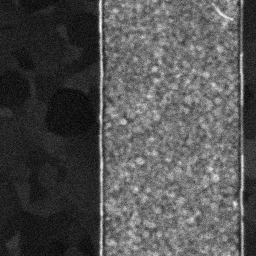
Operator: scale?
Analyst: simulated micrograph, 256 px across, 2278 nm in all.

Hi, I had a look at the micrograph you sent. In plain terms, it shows one or a few lines or trenches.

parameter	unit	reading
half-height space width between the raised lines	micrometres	1.24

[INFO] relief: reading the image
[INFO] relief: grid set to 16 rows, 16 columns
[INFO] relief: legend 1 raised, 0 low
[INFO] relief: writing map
1111110000000001
1111110000000001
1111110000000001
1111110000000001
1111110000000001
1111110000000001
1111110000000001
1111110000000001
1111110000000001
1111110000000001
1111110000000001
1111110000000001
1111110000000001
1111110000000001
1111110000000001
1111110000000001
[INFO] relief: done